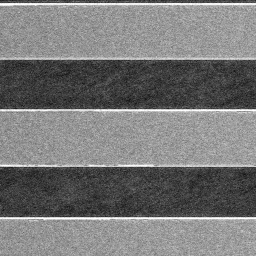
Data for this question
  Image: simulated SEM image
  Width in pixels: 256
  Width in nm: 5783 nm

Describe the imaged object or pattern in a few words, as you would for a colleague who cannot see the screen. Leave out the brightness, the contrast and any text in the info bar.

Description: lines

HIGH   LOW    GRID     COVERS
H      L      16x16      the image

HHHHHHHHHHHHHHHH
HHHHHHHHHHHHHHHH
HHHHHHHHHHHHHHHH
HHHHHHHHHHHHHHHH
LLLLLLLLLLLLLLLL
LLLLLLLLLLLLLLLL
LLLLLLLLLLLLLLLL
HHHHHHHHHHHHHHHH
HHHHHHHHHHHHHHHH
HHHHHHHHHHHHHHHH
LLLLLLLLLLLLLLLL
LLLLLLLLLLLLLLLL
LLLLLLLLLLLLLLLL
LLLLLLLLLLLLLLLL
HHHHHHHHHHHHHHHH
HHHHHHHHHHHHHHHH